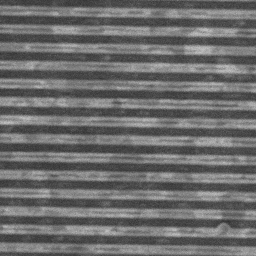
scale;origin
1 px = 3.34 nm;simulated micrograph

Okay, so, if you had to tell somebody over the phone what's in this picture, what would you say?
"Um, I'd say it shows parallel lines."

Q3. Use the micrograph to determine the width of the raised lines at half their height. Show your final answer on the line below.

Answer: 23.3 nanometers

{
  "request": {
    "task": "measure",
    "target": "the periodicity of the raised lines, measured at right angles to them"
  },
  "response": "60.7 nm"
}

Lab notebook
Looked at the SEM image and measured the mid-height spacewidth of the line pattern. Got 0.0367 µm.